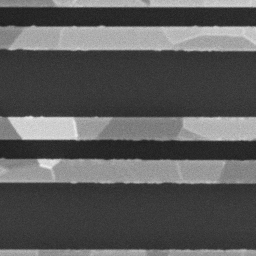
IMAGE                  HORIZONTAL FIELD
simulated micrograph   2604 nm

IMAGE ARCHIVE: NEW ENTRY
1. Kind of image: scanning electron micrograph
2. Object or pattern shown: lines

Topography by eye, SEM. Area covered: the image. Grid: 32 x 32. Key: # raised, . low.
################################
................................
................................
################################
################################
################################
................................
................................
................................
................................
................................
................................
................................
................................
................................
################################
################################
................................
................................
................................
################################
################################
################################
................................
................................
................................
................................
................................
................................
................................
................................
################################